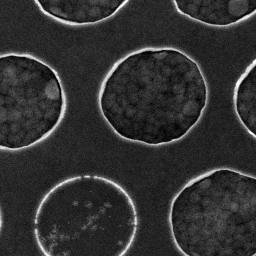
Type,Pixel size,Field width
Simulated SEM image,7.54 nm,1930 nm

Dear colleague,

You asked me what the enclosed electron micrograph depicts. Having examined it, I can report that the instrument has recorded holes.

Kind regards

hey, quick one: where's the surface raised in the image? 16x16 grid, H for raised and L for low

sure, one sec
HHHLLLLHHHHLLLLL
HHHHHHHHHHHHHLHH
HHHHHHHHHHHHHHHH
LHHHHHHHLLLLHHHH
LLLHHHHLLLLLHHHH
LLLLHHLLLLLLLHHL
LLLLHHLLLLLLLHHL
LLLLHHHLLLLLHHHL
LLLHHHHHLLLHHHHH
HHHHHHHHHHHHHHHH
HHHHHHHHHHHHHHHH
HHHHHHHHHHHHLLLL
HHHHHHHHHHHLLLLL
HHHHHHHHHHHLLLLL
HHHHHHHHHHHLLLLL
HHHHHHHHHHHLLLLL